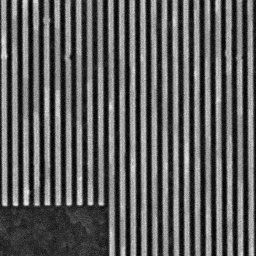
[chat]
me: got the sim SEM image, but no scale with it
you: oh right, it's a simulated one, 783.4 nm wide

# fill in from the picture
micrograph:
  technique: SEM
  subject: parallel lines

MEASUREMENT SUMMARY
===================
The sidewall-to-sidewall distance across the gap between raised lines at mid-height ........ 19.1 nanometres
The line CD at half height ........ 13.8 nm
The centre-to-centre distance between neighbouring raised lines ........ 10.7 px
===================